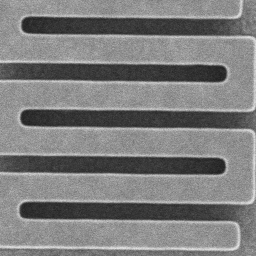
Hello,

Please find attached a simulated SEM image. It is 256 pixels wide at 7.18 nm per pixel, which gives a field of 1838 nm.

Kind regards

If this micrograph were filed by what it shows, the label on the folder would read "groups of lines, slits or small figures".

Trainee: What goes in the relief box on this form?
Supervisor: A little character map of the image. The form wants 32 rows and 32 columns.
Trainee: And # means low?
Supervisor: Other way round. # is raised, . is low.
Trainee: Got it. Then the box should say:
##############################..
##############################..
###.............................
###.............................
##################..............
################################
################################
################################
............................####
............................####
################################
################################
################################
################################
###.............................
###.............................
################################
################################
################################
............####################
............................####
............................####
################################
################################
################################
###.............................
##..............................
#####...........................
##############################..
##############################..
##############################..
................................